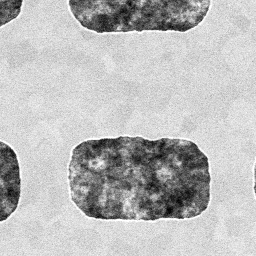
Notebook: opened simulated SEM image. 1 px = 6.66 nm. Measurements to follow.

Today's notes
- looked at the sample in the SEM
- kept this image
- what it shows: holes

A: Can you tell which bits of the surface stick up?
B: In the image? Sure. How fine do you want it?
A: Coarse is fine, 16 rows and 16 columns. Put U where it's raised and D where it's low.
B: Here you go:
DUUUDDDDDDDDDUUU
UUUUUDDDDDDDUUUU
UUUUUUUUUUUUUUUU
UUUUUUUUUUUUUUUU
UUUUUUUUUUUUUUUU
UUUUUUUUUUUUUUUU
UUUUUUUUUUUUUUUU
UUUUUUUUUUUUUUUU
UUUUUUUUUUUUUUUU
DUUUUDDDDDDDDUUU
DUUUDDDDDDDDDUUU
DUUUDDDDDDDDDUUU
DUUUUDDDDDDDDUUU
DUUUUUDDDDDDUUUU
UUUUUUUUUUUUUUUU
UUUUUUUUUUUUUUUU